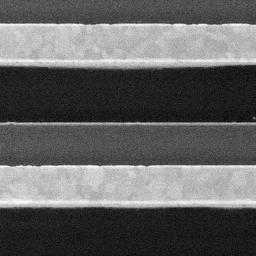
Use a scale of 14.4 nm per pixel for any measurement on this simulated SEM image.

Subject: lines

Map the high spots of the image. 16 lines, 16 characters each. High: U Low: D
UUUUUUUUUUUUUUUU
UUUUUUUUUUUUUUUU
UUUUUUUUUUUUUUUU
UUUUUUUUUUUUUUUU
DDDDDDDDDDDDDDDD
DDDDDDDDDDDDDDDD
DDDDDDDDDDDDDDDD
DDDDDDDDDDDDDDDD
UUUUUUUUUUUUUUUU
UUUUUUUUUUUUUUUU
UUUUUUUUUUUUUUUU
UUUUUUUUUUUUUUUU
UUUUUUUUUUUUUUUU
DDDDDDDDDDDDDDDD
DDDDDDDDDDDDDDDD
DDDDDDDDDDDDDDDD